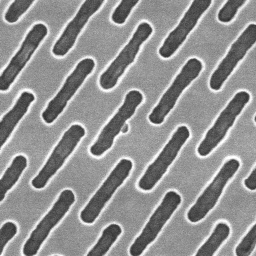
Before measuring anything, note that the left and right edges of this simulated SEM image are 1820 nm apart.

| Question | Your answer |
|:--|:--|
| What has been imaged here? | a regular array of holes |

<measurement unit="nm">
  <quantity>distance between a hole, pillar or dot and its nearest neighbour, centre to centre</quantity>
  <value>420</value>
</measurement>